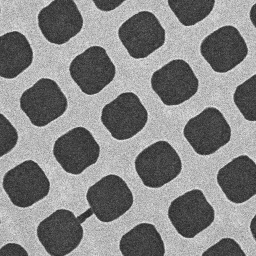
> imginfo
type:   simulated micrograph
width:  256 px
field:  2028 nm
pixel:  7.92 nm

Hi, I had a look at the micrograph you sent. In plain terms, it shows a regular array of holes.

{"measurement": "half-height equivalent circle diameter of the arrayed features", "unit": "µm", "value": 0.356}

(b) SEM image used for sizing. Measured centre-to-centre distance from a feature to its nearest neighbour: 0.463 µm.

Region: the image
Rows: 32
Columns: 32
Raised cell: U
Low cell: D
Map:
UUUUUUDDDUUUDDDUUUUUUDDDDDDUUUUU
UUUUUDDDDDUUUUUUUUDUUUDDDDUUUUUD
UUUUUDDDDDUUUUUUDDDDUUDDDUUUUUUD
UUUUUDDDDDUUUUUDDDDDUUUUUUUDDUUU
DDDUUUDDDUUUUUUDDDDDDUUUUUDDDDUU
DDDDUUUDUUUUUUUDDDDDUUUUUDDDDDDU
DDDDUUUUUUDDDUUUDDDUUUUUUDDDDDDU
DDDDUUUUUDDDDDUUUUUUUUDUUUDDDDUU
DDDUUUUUUDDDDDUUUUUUDDDDUUUDDUUU
DDUUUUUUUDDDDDUUUUUDDDDDUUUUUUUU
UUUUDDDUUUDDDDUUUUUDDDDDDUUUUUDD
UUUDDDDDUUDDUUUUUUUDDDDDDUUUUDDD
UUUDDDDDUUUUUUDDDUUUDDDUUUUUUDDD
UUUDDDDDUUUUUDDDDDUUUUUUUUDUUUDD
UUUDDDDUUUUUUDDDDDUUUUUUUDDDUUDD
DUUUDDUUUUUUUDDDDDUUUUUDDDDDDUUU
DDUUUUUUDDDUUUDDDUUUUUUDDDDDDUUU
DDUUUUUDDDDDUUUUUUUUUUUDDDDDDUUU
DDUUUUUDDDDDUUUUUUDDDDUUDDDUUUUU
UUUUUUUDDDDDUUUUUDDDDDUUUUUUUUDU
UUDDDUUDDDDDUUUUUDDDDDDUUUUUDDDD
UDDDDUUUDDUUUUUUUDDDDDUUUUUDDDDD
DDDDDDUUUUUUUDDUUUDDDDUUUUUDDDDD
DDDDDDUUUUUDDDDDUUUUUUUUUUUUDDDD
UDDDDDUUUUUDDDDDDUUUUUUDDDUUDDDD
UUDDUUUUUUUDDDDDDUUUUDDDDDUUUUUU
UUUUUUUDDUUDDDDDUUUUUDDDDDDUUUUU
UUUUUDDDDDDUDDUUUUUUUDDDDDDUUUUU
UUUUUDDDDDUUUUUUUDDUUUDDDDUUUUUD
UUUUUDDDDDUUUUUDDDDDUUUDUUUUUUUU
UDUUUDDDDDUUUUUDDDDDUUUUUUUDDDUU
DDDUUUDDDUUUUUUDDDDDDUUUUUDDDDUU